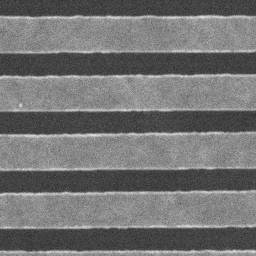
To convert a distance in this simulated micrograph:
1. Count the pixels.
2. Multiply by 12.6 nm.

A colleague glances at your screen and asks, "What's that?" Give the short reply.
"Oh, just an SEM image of lines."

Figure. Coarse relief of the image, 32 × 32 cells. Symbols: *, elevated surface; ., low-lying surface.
................................
................................
********************************
********************************
********************************
********************************
***************.................
................................
................................
...............***..***.********
********************************
********************************
********************************
********************************
................................
................................
................................
********************************
********************************
********************************
********************************
................................
................................
................................
********************************
********************************
********************************
********************************
................................
................................
................................
********************************